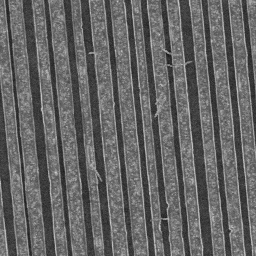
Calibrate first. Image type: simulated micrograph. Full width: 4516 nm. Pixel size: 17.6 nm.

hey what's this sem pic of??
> parallel lines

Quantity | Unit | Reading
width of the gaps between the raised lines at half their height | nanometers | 125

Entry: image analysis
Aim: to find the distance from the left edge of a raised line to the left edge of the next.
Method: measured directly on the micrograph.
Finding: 345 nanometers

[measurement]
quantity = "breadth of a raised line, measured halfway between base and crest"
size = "204 nanometers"